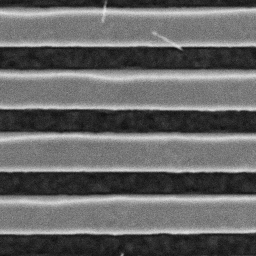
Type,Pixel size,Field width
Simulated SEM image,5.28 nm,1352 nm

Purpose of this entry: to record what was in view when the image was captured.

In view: lines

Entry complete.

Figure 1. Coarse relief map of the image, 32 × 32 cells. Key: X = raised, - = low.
--------------------------------
XXXXXXXXXXXXXXXXXXXXXXXXXXXXXXXX
XXXXXXXXXXXXXXXXXXXXXXXXXXXXXXXX
XXXXXXXXXXXXXXXXXXXXXXXXXXXXXXXX
XXXXXXXXXXXXXXXXXXXXXXXXXXXXXXXX
XXXXXXXXXXXXXXXXXXXXXXXXXXXXXXXX
--------------------------------
--------------------------------
--------------------------------
XXXXXXXXXXXXXXXXXXXXXXXXXXXXXXXX
XXXXXXXXXXXXXXXXXXXXXXXXXXXXXXXX
XXXXXXXXXXXXXXXXXXXXXXXXXXXXXXXX
XXXXXXXXXXXXXXXXXXXXXXXXXXXXXXXX
XXXXXXXXXXXXXXXXXXXXXXXXXXXXXXXX
--------------------------------
--------------------------------
--------------------------------
XXXXXXXXXXXXXXXXXXXXXXXXXXXXXXXX
XXXXXXXXXXXXXXXXXXXXXXXXXXXXXXXX
XXXXXXXXXXXXXXXXXXXXXXXXXXXXXXXX
XXXXXXXXXXXXXXXXXXXXXXXXXXXXXXXX
---------------------XXXXX--XX-X
--------------------------------
--------------------------------
--------------------------------
XXXXXXXXXXXXXXXXXXXXXXXXXXXXXXXX
XXXXXXXXXXXXXXXXXXXXXXXXXXXXXXXX
XXXXXXXXXXXXXXXXXXXXXXXXXXXXXXXX
XXXXXXXXXXXXXXXXXXXXXXXXXXXXXXXX
--------------------------------
--------------------------------
--------------------------------